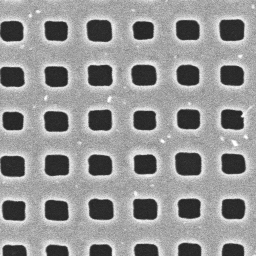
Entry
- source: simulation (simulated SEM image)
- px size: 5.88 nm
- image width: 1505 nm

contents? a regular array of holes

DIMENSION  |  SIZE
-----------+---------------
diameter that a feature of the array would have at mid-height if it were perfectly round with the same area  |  24 pixels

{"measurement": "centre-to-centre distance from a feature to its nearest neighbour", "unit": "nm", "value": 257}